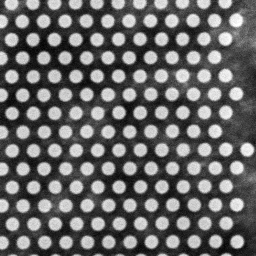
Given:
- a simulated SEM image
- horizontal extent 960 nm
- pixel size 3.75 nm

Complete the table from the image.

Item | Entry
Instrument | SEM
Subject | a regular array of raised bodies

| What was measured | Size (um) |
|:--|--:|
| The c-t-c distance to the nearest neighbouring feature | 0.079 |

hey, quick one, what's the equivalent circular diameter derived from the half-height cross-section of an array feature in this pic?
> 47.9 nm